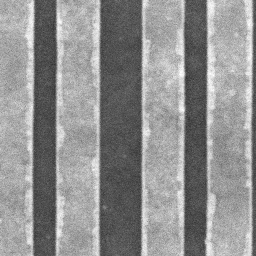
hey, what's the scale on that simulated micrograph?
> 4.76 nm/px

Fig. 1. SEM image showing one or a few lines or trenches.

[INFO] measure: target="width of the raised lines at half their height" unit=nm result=193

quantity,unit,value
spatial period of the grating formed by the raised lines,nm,361